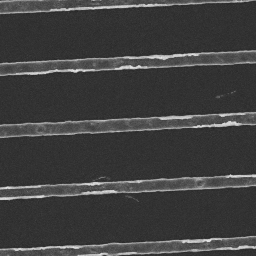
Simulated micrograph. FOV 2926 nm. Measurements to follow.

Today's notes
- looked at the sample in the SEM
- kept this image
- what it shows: parallel lines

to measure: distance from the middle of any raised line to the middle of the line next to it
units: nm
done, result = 707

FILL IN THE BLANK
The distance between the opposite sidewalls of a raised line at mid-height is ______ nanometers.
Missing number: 133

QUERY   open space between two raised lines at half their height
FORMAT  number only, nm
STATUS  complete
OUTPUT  569